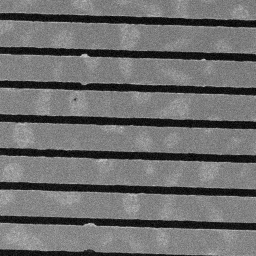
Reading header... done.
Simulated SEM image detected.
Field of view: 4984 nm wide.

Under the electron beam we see parallel lines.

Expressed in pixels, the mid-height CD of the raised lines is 25.5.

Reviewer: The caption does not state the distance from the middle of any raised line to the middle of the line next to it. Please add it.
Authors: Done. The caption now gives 657 nm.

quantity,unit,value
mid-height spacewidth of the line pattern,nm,160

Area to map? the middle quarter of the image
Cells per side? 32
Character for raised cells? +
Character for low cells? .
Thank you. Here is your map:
+++++++.++++++++++++++++++++++++
++++++++++++++++++++++++++++++++
++++++++++++++++++++++++++++++++
++++++++++++++++++++++++++++++++
....++++++++++++++++++++++++++++
................................
................................
+++..+++++++++++++++++++++++++++
++...+++++++++++++++.+++++++++++
++...+++++++++++++++++++++++++++
++++++++++++++++++++++++++++++++
++.+++++++++++++++++++++++++++++
++++++++++++++++++++++++++++++++
.......................+++++++++
................................
++++++++++++++..++..............
++++++++++++++++++++++++++++++++
++++++++++++++++++++++++++++++++
++++++++++++++++++++++++++++++++
++++++++++++++++++++++++++++++++
++++++++++++++++++++++++++++++++
....+...++++++++++++++++++++++++
................................
++..............................
++++++++++++++++++++++++++++++++
++++++++++++++++++++++++++++++++
++++++++++++++++++++++++++++++++
++++++++++++++++++++++++++++++++
++++++++++++++++++++++++++++++++
++++++++++++++++++++++++++++++++
.........................+++++++
................................